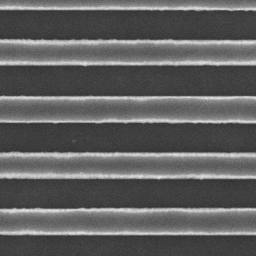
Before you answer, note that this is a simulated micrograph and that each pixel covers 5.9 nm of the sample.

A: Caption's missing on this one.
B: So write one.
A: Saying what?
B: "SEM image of lines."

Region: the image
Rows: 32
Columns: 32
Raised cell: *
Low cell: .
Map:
********************************
................................
................................
................................
................................
********************************
********************************
********************************
................................
................................
................................
................................
********************************
********************************
********************************
................................
................................
................................
................................
********************************
********************************
********************************
................................
................................
................................
................................
********************************
********************************
********************************
................................
................................
................................